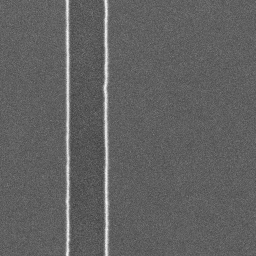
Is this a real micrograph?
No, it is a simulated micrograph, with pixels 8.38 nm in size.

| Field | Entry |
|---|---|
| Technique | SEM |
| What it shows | one or a few lines or trenches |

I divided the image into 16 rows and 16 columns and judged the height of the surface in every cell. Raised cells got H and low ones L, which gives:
HHHHLLLHHHHHHHHH
HHHHLLLHHHHHHHHH
HHHHLLLHHHHHHHHH
HHHHLLLHHHHHHHHH
HHHHLLLHHHHHHHHH
HHHHLLLHHHHHHHHH
HHHHLLLHHHHHHHHH
HHHHLLLHHHHHHHHH
HHHHLLLHHHHHHHHH
HHHHLLLHHHHHHHHH
HHHHLLLHHHHHHHHH
HHHHLLLHHHHHHHHH
HHHHLLLHHHHHHHHH
HHHHLLLHHHHHHHHH
HHHHLLLHHHHHHHHH
HHHHLLLHHHHHHHHH